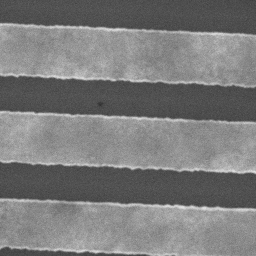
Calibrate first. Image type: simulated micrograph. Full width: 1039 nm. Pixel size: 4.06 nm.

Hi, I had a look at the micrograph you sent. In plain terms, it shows lines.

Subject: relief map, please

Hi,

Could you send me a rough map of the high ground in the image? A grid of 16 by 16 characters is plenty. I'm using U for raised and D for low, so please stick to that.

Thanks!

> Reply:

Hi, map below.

DDDDDDDDDDDDDDDD
DDDDDDDDDDDDDDDD
UUUUUUUUUUUUUUUU
UUUUUUUUUUUUUUUU
UUUUUUUUUUUUUUUU
DDDDDDDDDDDDDDDD
DDDDDDDDDDDDDDDD
UUUUUUUUUUUUDDDD
UUUUUUUUUUUUUUUU
UUUUUUUUUUUUUUUU
DDDDDDDDUUUUUUUU
DDDDDDDDDDDDDDDD
UUDDDDDDDDDDDDDD
UUUUUUUUUUUUUUUU
UUUUUUUUUUUUUUUU
DUUUUUUUUUUUUUUU